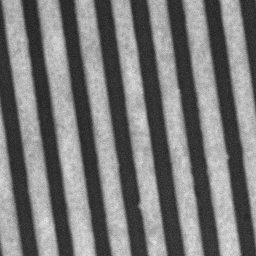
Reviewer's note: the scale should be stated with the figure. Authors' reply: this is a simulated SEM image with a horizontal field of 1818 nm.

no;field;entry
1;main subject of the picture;parallel lines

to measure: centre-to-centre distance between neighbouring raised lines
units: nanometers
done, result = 256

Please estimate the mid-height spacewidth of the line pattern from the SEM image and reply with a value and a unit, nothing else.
126 nanometers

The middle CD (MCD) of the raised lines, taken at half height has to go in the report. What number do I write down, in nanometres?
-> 126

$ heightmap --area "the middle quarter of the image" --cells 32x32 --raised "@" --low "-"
@----@@@@@----@@@@@----@@@@@----
@----@@@@@----@@@@@-----@@@@----
@-----@@@@-----@@@@-----@@@@----
@-----@@@@-----@@@@-----@@@@----
@-----@@@@-----@@@@-----@@@@----
@-----@@@@-----@@@@-----@@@@----
@@----@@@@@----@@@@@-----@@@@---
@@----@@@@@-----@@@@-----@@@@---
@@-----@@@@-----@@@@-----@@@@---
@@-----@@@@-----@@@@-----@@@@---
@@-----@@@@-----@@@@-----@@@@---
@@@----@@@@-----@@@@-----@@@@---
@@@----@@@@-----@@@@-----@@@@---
@@@----@@@@-----@@@@@----@@@@---
@@@----@@@@-----@@@@@-----@@@@--
@@@-----@@@@----@@@@@-----@@@@--
@@@-----@@@@-----@@@@-----@@@@--
@@@-----@@@@-----@@@@-----@@@@--
@@@@----@@@@-----@@@@-----@@@@--
@@@@----@@@@-----@@@@-----@@@@--
@@@@----@@@@@----@@@@@----@@@@@-
@@@@----@@@@@----@@@@@-----@@@@-
@@@@-----@@@@-----@@@@-----@@@@-
@@@@-----@@@@-----@@@@-----@@@@-
@@@@-----@@@@-----@@@@-----@@@@-
@@@@@----@@@@-----@@@@-----@@@@-
@@@@@----@@@@-----@@@@-----@@@@-
@@@@@----@@@@@----@@@@@----@@@@@
@@@@@----@@@@@----@@@@@-----@@@@
@@@@@-----@@@@-----@@@@-----@@@@
@@@@@-----@@@@-----@@@@-----@@@@
@@@@@@----@@@@-----@@@@-----@@@@